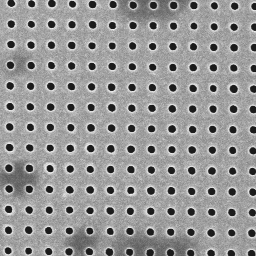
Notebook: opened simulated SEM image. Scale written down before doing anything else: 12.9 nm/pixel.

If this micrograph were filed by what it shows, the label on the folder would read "a regular array of holes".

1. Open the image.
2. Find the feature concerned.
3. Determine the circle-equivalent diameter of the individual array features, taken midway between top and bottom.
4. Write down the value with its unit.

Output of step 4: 0.0965 um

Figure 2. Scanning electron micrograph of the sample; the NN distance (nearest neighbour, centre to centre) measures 0.26 um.